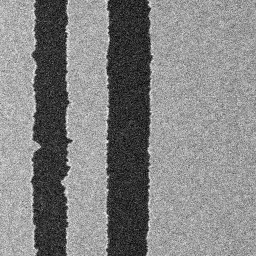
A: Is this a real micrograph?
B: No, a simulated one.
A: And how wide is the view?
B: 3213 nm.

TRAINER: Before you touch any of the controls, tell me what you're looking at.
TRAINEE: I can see one or a few lines or trenches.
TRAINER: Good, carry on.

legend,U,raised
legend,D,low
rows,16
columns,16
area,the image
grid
UUDDUUUDDUUUUUUU
UUDDUUUDDUUUUUUU
UUDDUUUDDUUUUUUU
UUDDUUUDDDUUUUUU
UUDDUUUDDUUUUUUU
UUDDUUUDDUUUUUUU
UUDDUUUDDUUUUUUU
UUDDUUUDDUUUUUUU
UUDDUUUDDUUUUUUU
UUDDUUUDDUUUUUUU
UUDDUUUDDUUUUUUU
UUDDUUUDDUUUUUUU
UUDDUUUDDUUUUUUU
UUDDUUUDDUUUUUUU
UUDDUUUDDUUUUUUU
UUDDUUUDDUUUUUUU